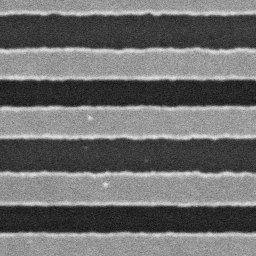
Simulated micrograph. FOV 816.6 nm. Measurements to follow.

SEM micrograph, lines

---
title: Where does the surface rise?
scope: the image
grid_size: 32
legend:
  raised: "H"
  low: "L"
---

HHHHHHHHHHHHHHHHHHHHHHHHHHHHHHHH
HHHHHHHHHHHHHHHHHHHHHHHHHHHHHHHH
LLLLLLLLLLLLLLLLLLLLLLLLLLLLLLLL
LLLLLLLLLLLLLLLLLLLLLLLLLLLLLLLL
LLLLLLLLLLLLLLLLLLLLLLLLLLLLLLLL
LLLLLLLLLLLLLLLLLLLLLLLLLLLLLLLL
HHHHHHHHHHHHHHHHHHHHHHHHHHHHHHHH
HHHHHHHHHHHHHHHHHHHHHHHHHHHHHHHH
HHHHHHHHHHHHHHHHHHHHHHHHHHHHHHHH
HHHHHHHHHHHHHHHHHHHHHHHHHHHHHHHH
LLLLLLLLLLLLLLLLLLLLLLLLLLLLLLLL
LLLLLLLLLLLLLLLLLLLLLLLLLLLLLLLL
LLLLLLLLLLLLLLLLLLLLLLLLLLLLLLLL
HHHHHHHHHHHHHHHHHHHHHHHHHHHHHHHH
HHHHHHHHHHHHHHHHHHHHHHHHHHHHHHHH
HHHHHHHHHHHHHHHHHHHHHHHHHHHHHHHH
HHHHHHHHHHHHHHHHHHHHHHHHHHHHHHHH
LLLLLLLLLLLLLLLLLLLLLLLLLLLLLLLL
LLLLLLLLLLLLLLLLLLLLLLLLLLLLLLLL
LLLLLLLLLLLLLLLLLLLLLLLLLLLLLLLL
LLLLLLLLLLLLLLLLLLLLLLLLLLLLLLLL
HLLLLHLLLLLLLLLHLLLLLLLLHLLLHLLL
HHHHHHHHHHHHHHHHHHHHHHHHHHHHHHHH
HHHHHHHHHHHHHHHHHHHHHHHHHHHHHHHH
HHHHHHHHHHHHHHHHHHHHHHHHHHHHHHHH
HHHHHHHHHHHHHHHHHHHHHHHHHHHHHHHH
LLLLLLLLLLLLLLLLLLLLLLLLLLLLLLLL
LLLLLLLLLLLLLLLLLLLLLLLLLLLLLLLL
LLLLLLLLLLLLLLLLLLLLLLLLLLLLLLLL
HHHHHHHHHHHHHHHHHHHHHHHHHHHHHHHH
HHHHHHHHHHHHHHHHHHHHHHHHHHHHHHHH
HHHHHHHHHHHHHHHHHHHHHHHHHHHHHHHH